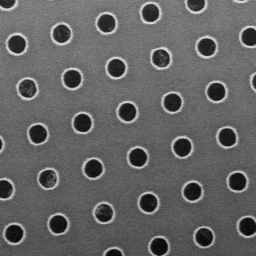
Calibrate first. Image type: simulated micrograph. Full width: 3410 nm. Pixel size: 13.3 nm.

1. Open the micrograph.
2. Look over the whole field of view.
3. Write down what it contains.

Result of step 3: a regular array of raised bodies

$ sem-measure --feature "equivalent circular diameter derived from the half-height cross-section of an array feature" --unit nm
275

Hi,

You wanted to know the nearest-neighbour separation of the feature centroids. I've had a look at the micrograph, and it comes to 0.605 microns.